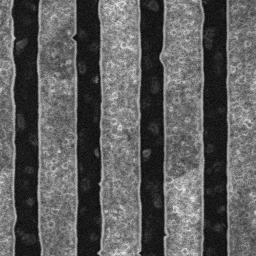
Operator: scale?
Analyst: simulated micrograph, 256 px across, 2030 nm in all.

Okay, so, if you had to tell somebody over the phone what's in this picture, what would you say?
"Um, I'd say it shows one or a few lines or trenches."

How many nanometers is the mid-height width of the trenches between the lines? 196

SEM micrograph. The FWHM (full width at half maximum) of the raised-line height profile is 298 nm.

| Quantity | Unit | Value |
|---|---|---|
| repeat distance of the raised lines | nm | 496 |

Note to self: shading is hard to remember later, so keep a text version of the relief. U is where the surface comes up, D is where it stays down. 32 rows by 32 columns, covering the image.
UDDDDUUUUDDDUUUUUDDDDUUUUDDDUUUU
UDDDDUUUUDDDUUUUUDDDDUUUUDDDUUUU
UUDDDUUUUDDDDUUUUDDDDUUUUDDDUUUU
UUDDDUUUUDDDDUUUUDDDUUUUUDDDUUUU
UUDDDUUUUDDDDUUUUDDDUUUUUDDDUUUU
UUDDDUUUUDDDDUUUUDDDUUUUUDDDUUUU
UDDDDUUUUDDDDUUUUDDDUUUUUDDDUUUU
UUDDDUUUUDDDDUUUUDDDUUUUUDDDUUUU
UUDDDUUUUDDDDUUUUDDDUUUUUDDDUUUU
UUDDDUUUUUDDDUUUUUDDDUUUUDDDUUUU
UUDDDUUUUUDDDUUUUDDDDUUUUDDDUUUU
UUDDDUUUUUDDDUUUUDDDDUUUUDDDDUUU
UUDDDUUUUUDDDUUUUDDDDUUUUDDDDUUU
UUDDDUUUUDDDDUUUUDDDDUUUUDDDDUUU
UUDDDUUUUUDDDUUUUDDDDUUUUDDDDUUU
UUDDDUUUUUDDDUUUUDDDDUUUUDDDDUUU
UUDDDUUUUDDDDUUUUUDDDUUUUDDDDUUU
UUDDDUUUUUDDDUUUUUDDDUUUUDDDDUUU
UUDDDUUUUDDDDUUUUDDDDUUUUDDDDUUU
UUDDDUUUUDDDDUUUUDDDDUUUUDDDDUUU
UUDDDUUUUDDDDUUUUUDDDUUUUDDDUUUU
UUDDDUUUUUDDDUUUUUDDDUUUUDDDUUUU
UUDDDUUUUUDDDUUUUUDDDUUUUDDDDUUU
UUDDDUUUUUDDDUUUUDDDDUUUUDDDUUUU
UUDDDUUUUUDDDUUUUDDDDUUUUDDDDUUU
UUDDDUUUUUDDDUUUUUDDDUUUUDDDUUUU
UUDDDUUUUUDDDUUUUUDDDUUUUDDDUUUU
UUDDDUUUUUDDDUUUUUDDDUUUUDDDDUUU
UUDDDUUUUDDDDUUUUUDDDUUUUDDDDUUU
UUDDDUUUUUDDDUUUUUDDDUUUUDDDUUUU
UUDDDUUUUUDDDUUUUUDDDUUUUDDDUUUU
UUDDDUUUUUDDUUUUUDDDDUUUUDDDDUUU